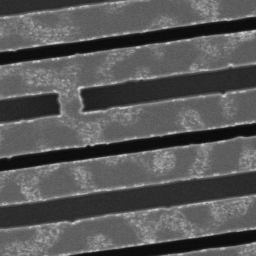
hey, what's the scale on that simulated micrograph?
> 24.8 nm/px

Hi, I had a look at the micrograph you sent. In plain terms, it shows parallel lines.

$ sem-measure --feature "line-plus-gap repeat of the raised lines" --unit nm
1320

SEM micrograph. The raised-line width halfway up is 870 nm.